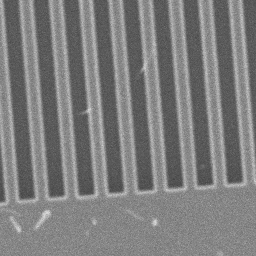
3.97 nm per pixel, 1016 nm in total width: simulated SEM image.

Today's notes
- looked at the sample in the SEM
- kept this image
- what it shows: parallel lines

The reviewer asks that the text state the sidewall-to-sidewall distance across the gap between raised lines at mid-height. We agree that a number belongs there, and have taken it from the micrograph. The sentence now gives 68.8 nanometres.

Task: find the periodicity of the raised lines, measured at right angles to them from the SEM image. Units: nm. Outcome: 118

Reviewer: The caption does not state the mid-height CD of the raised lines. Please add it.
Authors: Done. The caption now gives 51 nm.